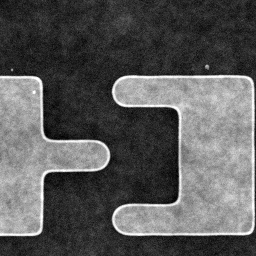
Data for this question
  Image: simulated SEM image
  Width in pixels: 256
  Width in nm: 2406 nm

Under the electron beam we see groups of lines, slits or small figures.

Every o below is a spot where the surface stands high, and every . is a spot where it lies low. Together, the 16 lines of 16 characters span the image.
................
................
................
................
................
ooo....ooooooooo
ooo.....oooooooo
ooo........ooooo
ooo........ooooo
ooooooo....ooooo
oooooo.....ooooo
ooo........ooooo
ooo........ooooo
ooo....ooooooooo
oo......oooooooo
................